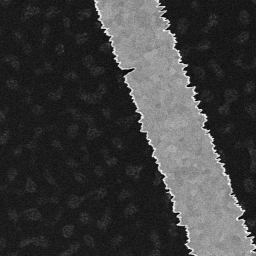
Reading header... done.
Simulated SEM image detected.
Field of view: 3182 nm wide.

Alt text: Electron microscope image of one or a few lines or trenches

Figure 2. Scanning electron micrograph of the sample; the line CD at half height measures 718 nm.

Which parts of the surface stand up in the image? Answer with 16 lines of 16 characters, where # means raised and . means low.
......####......
......####......
.......####.....
.......####.....
........####....
........####....
........####....
.........####...
.........####...
..........###...
..........####..
..........####..
...........####.
...........####.
............###.
............####